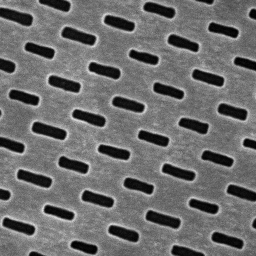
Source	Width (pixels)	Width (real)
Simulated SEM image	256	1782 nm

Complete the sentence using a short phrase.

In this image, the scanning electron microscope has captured a regular array of holes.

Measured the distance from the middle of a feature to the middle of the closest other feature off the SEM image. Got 286 nm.